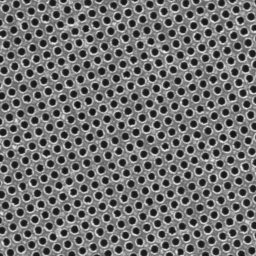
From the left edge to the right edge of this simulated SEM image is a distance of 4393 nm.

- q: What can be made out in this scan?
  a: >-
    a regular array of holes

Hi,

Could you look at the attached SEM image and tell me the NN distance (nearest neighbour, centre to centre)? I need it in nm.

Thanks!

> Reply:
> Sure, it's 191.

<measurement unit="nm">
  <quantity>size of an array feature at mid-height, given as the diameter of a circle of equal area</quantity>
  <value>133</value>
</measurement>